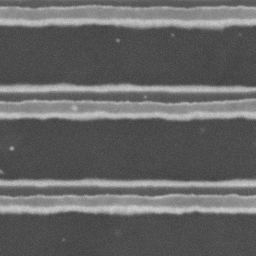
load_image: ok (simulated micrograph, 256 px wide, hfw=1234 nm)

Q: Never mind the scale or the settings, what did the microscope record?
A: lines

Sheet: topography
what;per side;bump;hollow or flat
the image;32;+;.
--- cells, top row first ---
++++++++++++++++++++++++++++++++
++++++++++++++++++++++++++++++++
++++++...+..++++++++++++++++++++
................................
................................
................................
................................
................................
................................
................................
................................
++++++++++++++++++++++++++++++++
++++++++++++++++++++++++++++++++
++++++++++++++++++++++++++++++++
................................
................................
................................
................................
................................
................................
................................
................................
................................
++++++++++++++++++++++++++++++++
++++++++++++++++++++++++++++++++
++++++++++++++++++++++++++++++++
................................
................................
................................
................................
................................
................................